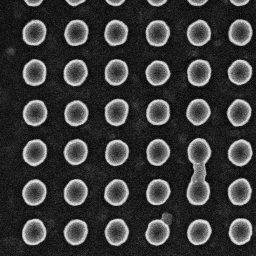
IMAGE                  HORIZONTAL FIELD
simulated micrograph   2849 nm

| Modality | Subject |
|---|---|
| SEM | a regular array of raised bodies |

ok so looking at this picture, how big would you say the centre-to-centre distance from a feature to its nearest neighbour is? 441 nm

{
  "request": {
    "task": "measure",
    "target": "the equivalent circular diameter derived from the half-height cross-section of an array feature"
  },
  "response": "23.5 pixels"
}